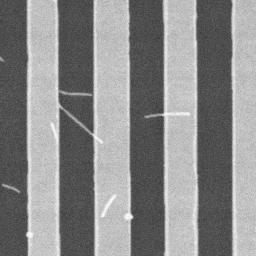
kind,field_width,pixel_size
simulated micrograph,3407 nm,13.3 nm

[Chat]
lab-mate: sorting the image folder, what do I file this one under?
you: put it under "lines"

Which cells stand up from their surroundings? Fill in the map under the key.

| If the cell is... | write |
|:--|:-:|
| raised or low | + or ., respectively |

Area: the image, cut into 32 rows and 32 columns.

...++++.....++++....++++.....+++
...++++.....++++....++++.....+++
...++++.....++++....++++.....+++
...++++.....++++.....+++.....+++
...++++.....++++.....+++.....+++
...++++.....++++.....+++.....+++
...++++.....++++.....++++....+++
....+++.....++++.....+++.....+++
...++++.....++++.....++++....+++
...++++.....++++.....+++.....+++
...++++.....++++.....++++....+++
...++++.....++++.....++++....+++
...++++.....++++.....++++....+++
...++++.....++++.....++++....+++
...++++.....++++....+++++....+++
...++++.....++++.....++++....+++
...++++.....++++.....++++....+++
...++++.....++++.....++++....+++
...++++.....++++.....++++....+++
...++++.....++++.....++++....+++
....+++.....++++.....++++....+++
....+++.....++++.....++++....+++
....+++.....++++.....++++....+++
...++++.....++++.....++++....+++
....+++.....++++.....++++....+++
...++++.....++++.....++++....+++
....+++.....++++.....++++....+++
....+++.....++++.....++++....+++
....+++.....++++.....++++....+++
...++++.....++++.....++++....+++
....+++.....++++.....++++....+++
....+++.....++++.....++++....+++